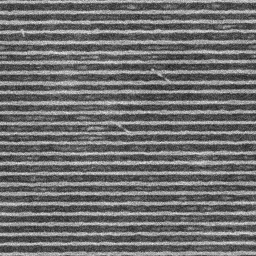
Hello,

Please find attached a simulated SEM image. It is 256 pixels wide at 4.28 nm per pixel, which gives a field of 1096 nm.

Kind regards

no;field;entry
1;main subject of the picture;parallel lines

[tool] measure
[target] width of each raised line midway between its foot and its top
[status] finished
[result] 10.7 nanometers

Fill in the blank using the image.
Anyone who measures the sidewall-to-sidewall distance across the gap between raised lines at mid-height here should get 31.6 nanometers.